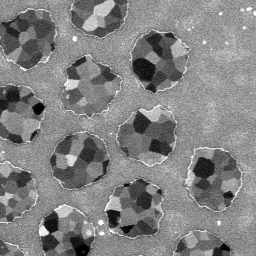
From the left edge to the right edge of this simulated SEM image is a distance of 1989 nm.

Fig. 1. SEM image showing raised bodies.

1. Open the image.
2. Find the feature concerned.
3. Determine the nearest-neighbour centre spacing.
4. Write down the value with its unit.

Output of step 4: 0.574 microns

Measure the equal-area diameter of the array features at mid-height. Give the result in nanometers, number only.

454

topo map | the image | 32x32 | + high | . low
.........+++++++................
...+++...+++++++................
.++++++..+++++++................
+++++++...+++++.................
+++++++.....+.....++++..........
+++++++..........++++++.........
+++++++.........++++++++........
.+++++....++....+++++++.........
...+....++++++...++++++.........
........+++++++..++++++.........
........+++++++...++++..........
++++....+++++++....+............
+++++...++++++..................
++++++..+++++......++...........
+++++...........++++++..........
+++++..........+++++++..........
+++++.....+....+++++++..........
.+++....+++++..+++++++..........
.......++++++..+++++++...+......
......++++++++..+++++...+++++...
+.....++++++++....+.....++++++..
+++....++++++...........++++++..
++++...+++++.....+.....+++++++..
++++....++....++++++...+++++++..
+++++.........++++++....+++++...
++++.........+++++++.....++++...
+++...++++...+++++++............
++...++++++..+++++++............
.....+++++++..++++++............
.....+++++++....++.....++++.....
+....+++++++..........++++++....
+++..++++++...........+++++++...